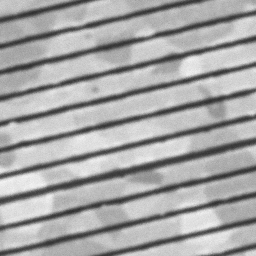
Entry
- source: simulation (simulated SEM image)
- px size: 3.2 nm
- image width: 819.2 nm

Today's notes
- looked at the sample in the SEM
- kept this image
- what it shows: parallel lines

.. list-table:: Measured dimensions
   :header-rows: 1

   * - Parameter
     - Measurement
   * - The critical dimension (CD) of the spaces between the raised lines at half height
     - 0.0211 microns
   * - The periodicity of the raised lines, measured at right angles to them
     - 80.9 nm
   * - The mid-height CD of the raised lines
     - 60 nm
